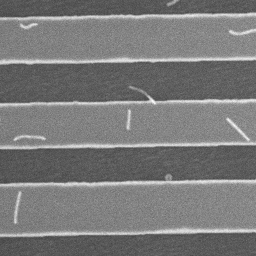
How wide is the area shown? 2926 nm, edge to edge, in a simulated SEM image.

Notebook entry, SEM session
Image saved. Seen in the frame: lines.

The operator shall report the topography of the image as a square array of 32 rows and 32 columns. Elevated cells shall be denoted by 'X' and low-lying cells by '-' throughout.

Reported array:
--------------------------------
--------------------------------
XXXXXXXXXXXXXXXXXXXXXXXXXXXXXXXX
XXXXXXXXXXXXXXXXXXXXXXXXXXXXXXXX
XXXXXXXXXXXXXXXXXXXXXXXXXXXXXXXX
XXXXXXXXXXXXXXXXXXXXXXXXXXXXXXXX
XXXXXXXXXXXXXXXXXXXXXXXXXXXXXXXX
XXXXXXXXXXXXXXXXXXXXXXXXX-------
--------------------------------
--------------------------------
--------------------------------
--------------------------------
------------------X-------X---XX
XXXXXXXXXXXXXXXXXXXXXXXXXXXXXXXX
XXXXXXXXXXXXXXXXXXXXXXXXXXXXXXXX
XXXXXXXXXXXXXXXXXXXXXXXXXXXXXXXX
XXXXXXXXXXXXXXXXXXXXXXXXXXXXXXXX
XXXXXXXXXXXXXXXXXXXXXXXXXXXXXXXX
XXXXX---------------------------
--------------------------------
--------------------------------
--------------------------------
--------------------------------
XXXXXXXXXXXXXXXXXXXXXXXXXXXXXXXX
XXXXXXXXXXXXXXXXXXXXXXXXXXXXXXXX
XXXXXXXXXXXXXXXXXXXXXXXXXXXXXXXX
XXXXXXXXXXXXXXXXXXXXXXXXXXXXXXXX
XXXXXXXXXXXXXXXXXXXXXXXXXXXXXXXX
XXXXXXXXXXXXXXXXXXXXXXXXXXXXXXXX
XXXXX---------------------------
--------------------------------
--------------------------------